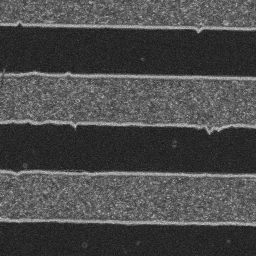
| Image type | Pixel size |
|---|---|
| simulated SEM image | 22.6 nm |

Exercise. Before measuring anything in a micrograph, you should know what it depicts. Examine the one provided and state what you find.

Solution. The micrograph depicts one or a few lines or trenches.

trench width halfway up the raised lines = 1120 nanometres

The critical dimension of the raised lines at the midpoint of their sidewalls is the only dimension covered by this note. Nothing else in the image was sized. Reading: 1100 nm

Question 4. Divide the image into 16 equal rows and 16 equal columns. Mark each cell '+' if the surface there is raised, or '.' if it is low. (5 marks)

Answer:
++++++++++++++++
++++++++++++++++
................
................
................
++++++++++++++++
++++++++++++++++
++++++++++++++++
................
................
................
++++++++++++++++
++++++++++++++++
++++++++++++++++
................
................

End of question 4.